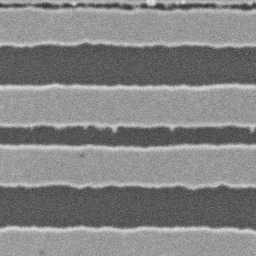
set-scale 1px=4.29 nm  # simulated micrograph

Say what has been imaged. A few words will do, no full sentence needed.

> lines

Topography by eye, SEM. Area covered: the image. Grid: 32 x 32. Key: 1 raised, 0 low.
00010000010000000011000000001100
11111111111111111111111111111111
11111111111111111111111111111111
11111111111111111111111111111111
11111111111111111111111111111111
11111001110000111111111111111111
00000000000000000000000000000000
00000000000000000000000000000000
00000000000000000000000000000000
00000000000000000000000000000000
00000000000000000000000000000000
11111111111111111111111111111111
11111111111111111111111111111111
11111111111111111111111111111111
11111111111111111111111111111111
11111111111111111111111111111111
00000000000000000000000000000000
00000000000000000000000000000000
11111111111111111111111111111111
11111111111111111111111111111111
11111111111111111111111111111111
11111111111111111111111111111111
11111111111111111111111111111111
00000000000000000000000010000000
00000000000000000000000000000000
00000000000000000000000000000000
00000000000000000000000000000000
00000000000000000000000000000000
01000000011001000110000011000000
11111111111111111111111111111111
11111111111111111111111111111111
11111111111111111111111111111111